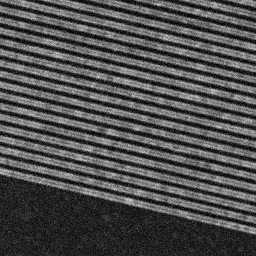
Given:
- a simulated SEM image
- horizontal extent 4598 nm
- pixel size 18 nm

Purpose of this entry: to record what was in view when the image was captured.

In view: parallel lines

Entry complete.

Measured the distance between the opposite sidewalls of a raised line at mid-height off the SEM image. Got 78.6 nm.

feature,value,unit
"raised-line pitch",0.189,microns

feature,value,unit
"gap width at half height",109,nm